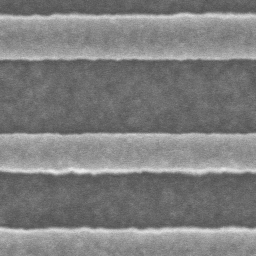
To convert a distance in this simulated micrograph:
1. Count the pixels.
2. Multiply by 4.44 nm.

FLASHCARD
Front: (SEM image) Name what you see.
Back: lines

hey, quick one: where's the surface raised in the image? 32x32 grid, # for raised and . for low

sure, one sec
................................
................................
################################
################################
################################
################################
################################
................................
................................
................................
................................
................................
................................
................................
................................
................................
................................
################################
################################
################################
################################
......##..#.....................
................................
................................
................................
................................
................................
................................
................................
################################
################################
################################